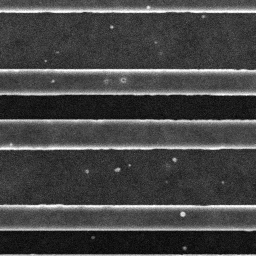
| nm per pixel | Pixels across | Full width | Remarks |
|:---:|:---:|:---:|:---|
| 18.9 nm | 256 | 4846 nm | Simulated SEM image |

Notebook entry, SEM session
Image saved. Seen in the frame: lines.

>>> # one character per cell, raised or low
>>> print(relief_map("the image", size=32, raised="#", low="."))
################################
................................
................................
................................
................................
................................
................................
................................
................................
################################
################################
################################
................................
................................
................................
################################
################################
################################
################################
................................
................................
................................
................................
................................
................................
................................
################################
################################
################################
................................
................................
................................